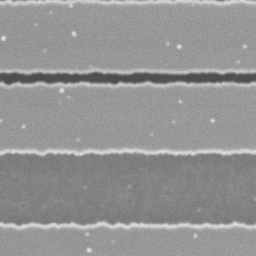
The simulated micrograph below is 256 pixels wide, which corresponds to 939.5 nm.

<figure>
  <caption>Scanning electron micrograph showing lines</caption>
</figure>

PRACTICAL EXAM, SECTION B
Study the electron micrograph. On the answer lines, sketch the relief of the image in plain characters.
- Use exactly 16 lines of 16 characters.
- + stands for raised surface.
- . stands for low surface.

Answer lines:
++++++++++++++++
++++++++++++++++
++++++++++++++++
++++++++++++++++
++++++++++++++++
++++++++++++++++
++++++++++++++++
++++++++++++++++
++++++++++++++++
++++++++++++++++
................
................
................
................
++++++++++++++++
++++++++++++++++